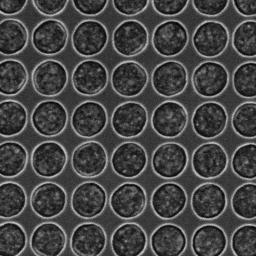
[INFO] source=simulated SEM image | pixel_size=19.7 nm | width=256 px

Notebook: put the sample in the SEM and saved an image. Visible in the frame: a regular array of holes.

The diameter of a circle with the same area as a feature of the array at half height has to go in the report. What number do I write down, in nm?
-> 672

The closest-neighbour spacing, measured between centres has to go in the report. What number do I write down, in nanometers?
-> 786